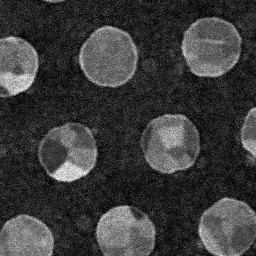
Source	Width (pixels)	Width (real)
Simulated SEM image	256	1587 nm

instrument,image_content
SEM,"raised bodies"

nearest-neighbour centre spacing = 638 nm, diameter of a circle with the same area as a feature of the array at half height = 359 nanometers